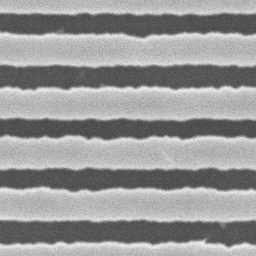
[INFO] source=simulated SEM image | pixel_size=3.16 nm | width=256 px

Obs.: lines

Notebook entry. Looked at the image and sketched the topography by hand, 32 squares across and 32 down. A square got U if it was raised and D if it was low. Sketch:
UUUUUUUUUUUUUUUUUUUUUUUUUUUUUUUU
UUUUUUUUUUUUUUUUUUUUUUUUUUUUUUUU
DDDDDDDDDDDDDDDDDDDDDDDDDDDDDDDD
DDDDDDDDDDDDDDDDDDDDDDDDDDDDDDDD
UUUUUUUUUUUUUUUUDDDUUUUUUUUUUUUU
UUUUUUUUUUUUUUUUUUUUUUUUUUUUUUUU
UUUUUUUUUUUUUUUUUUUUUUUUUUUUUUUU
UUUUUUUUUUUUUUUUUUUUUUUUUUUUUUUU
DDDDDDDDDDDDDDDDDDDDDDDDDDDDDDDD
DDDDDDDDDDDDDDDDDDDDDDDDDDDDDDDD
DDDDDDDDDDDDDDDDDDDDDDDDDDDDDDDD
UUUUUUUUUUUUUUUUUUUUUUUUUUUUUUUU
UUUUUUUUUUUUUUUUUUUUUUUUUUUUUUUU
UUUUUUUUUUUUUUUUUUUUUUUUUUUUUUUU
UUUUUUUUUUUUUUUUUUUUUUUUUUUUUUUU
DDDDDDDDDDDDDDDDDDDDDDDDDDDDDDDD
DDDDDDDDDDDDDDDDDDDDDDDDDDDDDDDD
UUUUUUUUUUUUUDUUUUUUUUUUUUUUUUUU
UUUUUUUUUUUUUUUUUUUUUUUUUUUUUUUU
UUUUUUUUUUUUUUUUUUUUUUUUUUUUUUUU
UUUUUUUUUUUUUUUUUUUUUUUUUUUUUUUU
DDDDDDDDDDDDDDDDDDDDDDDDDDDDDDDD
DDDDDDDDDDDDDDDDDDDDDDDDDDDDDDDD
UDDDUUDDDDDDDDDDDDDDDDDUDUDDDDDD
UUUUUUUUUUUUUUUUUUUUUUUUUUUUUUUU
UUUUUUUUUUUUUUUUUUUUUUUUUUUUUUUU
UUUUUUUUUUUUUUUUUUUUUUUUUUUUUUUU
DDUUUUUUUUDUUUUUUDUUUUUUUUUUUUUD
DDDDDDDDDDDDDDDDDDDDDDDDDDDDDDDD
DDDDDDDDDDDDDDDDDDDDDDDDDDDDDDDD
DDDDDDDUDUUUUUUUDUUDUUUUUUDDDDUD
UUUUUUUUUUUUUUUUUUUUUUUUUUUUUUUU